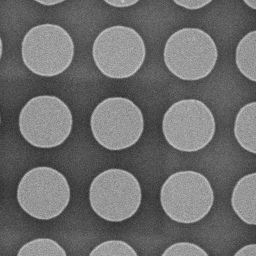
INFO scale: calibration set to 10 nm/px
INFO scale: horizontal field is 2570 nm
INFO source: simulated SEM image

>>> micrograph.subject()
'an array of small figures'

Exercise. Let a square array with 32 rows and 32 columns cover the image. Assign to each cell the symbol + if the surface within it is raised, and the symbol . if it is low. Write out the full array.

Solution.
......+.......+++.....++++.....+
................................
................................
....++++......++................
...++++++...+++++....+++++.....+
...++++++...++++++...++++++...++
...++++++...++++++...++++++...++
...++++++...++++++...++++++...++
....++++....+++++....++++++...++
..............++......++++.....+
................................
................................
....+++......+++.......+........
...+++++....+++++....+++++....++
..+++++++...++++++...++++++...++
..+++++++..+++++++..+++++++..+++
...++++++...++++++..+++++++..+++
...+++++....+++++....+++++....++
.............++.......+++......+
................................
................................
....+++......+++.......+........
...+++++....+++++....+++++....++
..+++++++..++++++...++++++...+++
..+++++++..+++++++..+++++++..+++
...+++++...++++++...++++++...+++
...+++++....+++++....+++++....++
..............+.......+++.....++
................................
................................
...++++......+++......++........
..++++++....+++++....+++++....++